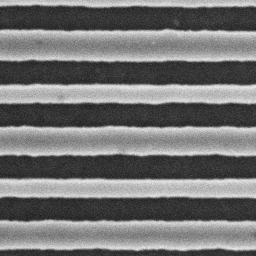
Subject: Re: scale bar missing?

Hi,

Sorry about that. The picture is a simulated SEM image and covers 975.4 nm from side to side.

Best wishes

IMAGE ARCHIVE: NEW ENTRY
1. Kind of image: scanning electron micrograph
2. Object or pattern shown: lines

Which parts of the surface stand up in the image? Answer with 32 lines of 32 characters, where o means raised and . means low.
oooooooooooooooooooooooooooooooo
................................
................................
................................
oooooooooooooooooooooooooooooooo
oooooooooooooooooooooooooooooooo
oooooooooooooooooooooooooooooooo
oooooooooooooooooooooooooooooooo
................................
................................
................................
oooooooooooooooooooooooooooooooo
oooooooooooooooooooooooooooooooo
................................
................................
................................
oooooooooooooooooooooooooooooooo
oooooooooooooooooooooooooooooooo
oooooooooooooooooooooooooooooooo
................................
................................
................................
o..ooo...oooo...............oo.o
oooooooooooooooooooooooooooooooo
oooooooooooooooooooooooooooooooo
................................
................................
................................
oooooooooooooooooooooooooooooooo
oooooooooooooooooooooooooooooooo
oooooooooooooooooooooooooooooooo
................................